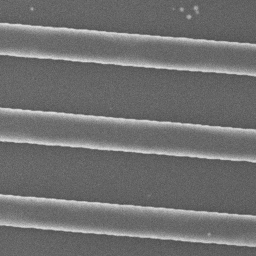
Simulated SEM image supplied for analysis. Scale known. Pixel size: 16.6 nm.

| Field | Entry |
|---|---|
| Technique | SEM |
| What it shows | lines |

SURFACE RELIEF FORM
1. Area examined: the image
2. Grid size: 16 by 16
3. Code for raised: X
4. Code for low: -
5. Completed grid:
----------------
X---------------
XXXXXXXXXXXXX---
-XXXXXXXXXXXXXXX
--------------XX
----------------
----------------
XXXXXXXXX-------
XXXXXXXXXXXXXXXX
--------XXXXXXXX
----------------
----------------
XXXX------------
XXXXXXXXXXXXXXXX
-----XXXXXXXXXXX
----------------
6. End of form